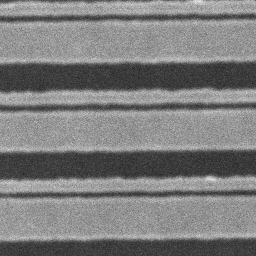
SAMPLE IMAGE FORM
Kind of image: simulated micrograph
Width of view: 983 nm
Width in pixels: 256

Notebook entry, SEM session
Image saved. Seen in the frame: lines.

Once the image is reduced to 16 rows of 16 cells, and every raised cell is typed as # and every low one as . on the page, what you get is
################
################
################
################
................
................
################
################
################
................
................
################
################
################
################
................